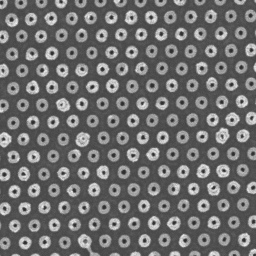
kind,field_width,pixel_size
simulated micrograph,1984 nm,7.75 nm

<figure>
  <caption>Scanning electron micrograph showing a regular array of ring-shaped raised bodies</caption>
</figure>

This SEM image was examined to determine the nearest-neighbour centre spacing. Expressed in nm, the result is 149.